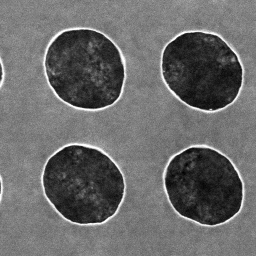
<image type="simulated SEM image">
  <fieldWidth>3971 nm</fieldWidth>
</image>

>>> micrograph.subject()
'holes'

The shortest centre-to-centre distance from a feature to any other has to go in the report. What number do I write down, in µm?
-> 1.79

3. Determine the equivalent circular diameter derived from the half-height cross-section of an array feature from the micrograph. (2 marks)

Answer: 1230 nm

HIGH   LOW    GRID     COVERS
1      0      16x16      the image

1111111111111111
1111111111111111
1110000111100011
1110000011000001
1110000011000001
1110000011100001
1111000111110011
1111111111111111
1111111111111111
1111001111100011
1110000111000001
1110000011000001
1110000011100001
1111000111110001
1111111111111111
1111111111111111